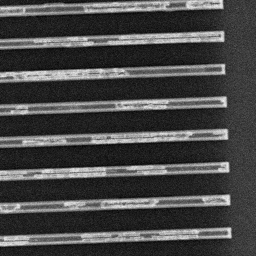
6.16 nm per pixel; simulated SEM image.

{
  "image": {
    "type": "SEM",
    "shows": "parallel lines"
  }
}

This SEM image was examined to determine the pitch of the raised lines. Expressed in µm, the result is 0.202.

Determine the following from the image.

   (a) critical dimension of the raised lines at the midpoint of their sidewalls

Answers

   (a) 53.1 nm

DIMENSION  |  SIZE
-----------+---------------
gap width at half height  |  0.153 um